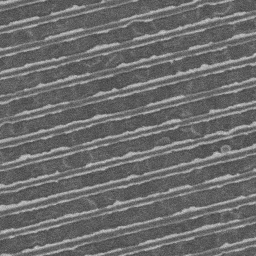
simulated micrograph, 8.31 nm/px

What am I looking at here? parallel lines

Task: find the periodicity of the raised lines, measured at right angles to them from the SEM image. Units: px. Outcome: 22.3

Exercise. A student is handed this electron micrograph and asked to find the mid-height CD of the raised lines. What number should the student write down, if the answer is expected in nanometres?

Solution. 73.7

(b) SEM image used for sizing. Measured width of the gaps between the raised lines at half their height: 0.112 um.